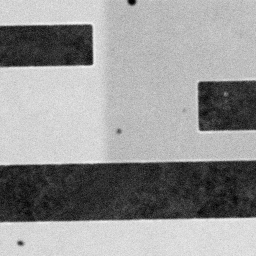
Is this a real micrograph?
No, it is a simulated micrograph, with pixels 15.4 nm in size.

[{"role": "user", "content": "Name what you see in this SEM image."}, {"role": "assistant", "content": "groups of lines, slits or small figures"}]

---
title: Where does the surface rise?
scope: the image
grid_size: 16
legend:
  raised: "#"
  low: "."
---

################
##...###########
......##########
......##########
################
############....
############....
############....
################
################
................
................
................
................
################
################